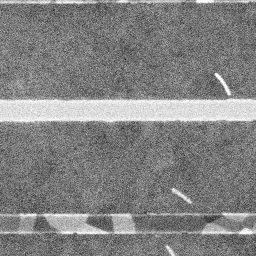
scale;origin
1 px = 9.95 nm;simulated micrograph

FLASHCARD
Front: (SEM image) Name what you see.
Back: lines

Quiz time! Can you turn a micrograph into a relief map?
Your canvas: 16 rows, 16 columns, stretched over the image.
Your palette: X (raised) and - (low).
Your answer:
----------------
----------------
----------------
----------------
----------------
----------------
----------------
----------------
----------------
----------------
----------------
----------------
----------------
XXXXXXXXXXXXXXXX
XXXXXXXXXXXXXXXX
----------------